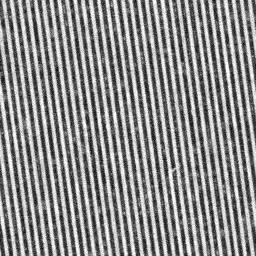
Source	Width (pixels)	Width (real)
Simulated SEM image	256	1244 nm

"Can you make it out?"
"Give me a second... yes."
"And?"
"parallel lines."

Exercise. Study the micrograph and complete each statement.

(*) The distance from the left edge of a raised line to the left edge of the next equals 38.2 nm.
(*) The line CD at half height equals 13.8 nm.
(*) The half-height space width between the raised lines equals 23.5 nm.